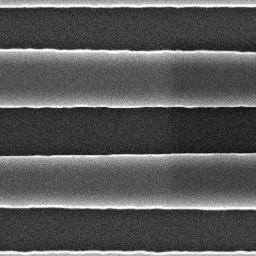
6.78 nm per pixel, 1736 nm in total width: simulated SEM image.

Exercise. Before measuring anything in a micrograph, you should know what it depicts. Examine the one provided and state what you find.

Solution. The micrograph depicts lines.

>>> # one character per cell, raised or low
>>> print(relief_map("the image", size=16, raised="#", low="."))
................
................
................
################
################
################
################
................
................
................
################
################
################
................
................
................